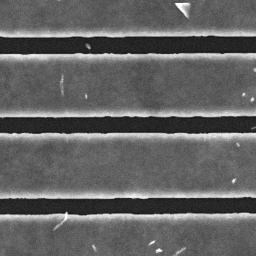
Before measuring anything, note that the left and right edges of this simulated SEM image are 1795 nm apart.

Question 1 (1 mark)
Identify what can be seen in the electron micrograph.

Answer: lines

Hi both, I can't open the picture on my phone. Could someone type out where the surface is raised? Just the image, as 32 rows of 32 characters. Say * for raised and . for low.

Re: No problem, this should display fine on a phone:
********************************
********************************
********************************
********************************
................................
................................
................................
********************************
********************************
********************************
********************************
********************************
********************************
********************************
................................
................................
................................
********************************
********************************
********************************
********************************
********************************
********************************
********************************
********************************
................................
................................
********************************
********************************
********************************
********************************
********************************